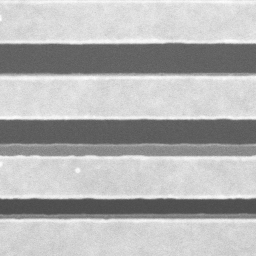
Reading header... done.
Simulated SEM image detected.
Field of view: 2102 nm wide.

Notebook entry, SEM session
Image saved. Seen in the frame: lines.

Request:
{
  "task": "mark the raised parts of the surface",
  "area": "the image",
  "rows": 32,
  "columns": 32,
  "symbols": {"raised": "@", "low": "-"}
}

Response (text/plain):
@@@@@@@@@@@@@@@@@@@@@@@@@@@@@@@@
@@@@@@@@@@@@@@@@@@@@@@@@@@@@@@@@
@@@@@@@@@@@@@@@@@@@@@@@@@@@@@@@@
@@@@@@@@@@@@@@@@@@@@@@@@@@@@@@@@
@@@@@@@@@@@@@@@@@@@@@@@@@@@@@@@@
--------------------------------
--------------------------------
--------------------------------
--------------------------------
@@@@@@@@@@@@@@@@@@@@@@@@@@@@@@@@
@@@@@@@@@@@@@@@@@@@@@@@@@@@@@@@@
@@@@@@@@@@@@@@@@@@@@@@@@@@@@@@@@
@@@@@@@@@@@@@@@@@@@@@@@@@@@@@@@@
@@@@@@@@@@@@@@@@@@@@@@@@@@@@@@@@
@@@@@@@@@@@@@@@@@@@@@@@@@@@@@@@@
--------------------------------
--------------------------------
--------------------------------
@@@@@@@@@@@@@@@@@@@@@@@@@@@@@@@@
@@@@@@@@@@@@@@@@@@@@@@@@@@@@@@@@
@@@@@@@@@@@@@@@@@@@@@@@@@@@@@@@@
@@@@@@@@@@@@@@@@@@@@@@@@@@@@@@@@
@@@@@@@@@@@@@@@@@@@@@@@@@@@@@@@@
@@@@@@@@@@@@@@@@@@@@@@@@@@@@@@@@
@@@@@@@@@@@@@@@@@@@@@@@@@@@@@@@@
--------------------------------
--------------------------------
@@@@@@@@@@@@@@@@@@@@@@@@@@@@@@@@
@@@@@@@@@@@@@@@@@@@@@@@@@@@@@@@@
@@@@@@@@@@@@@@@@@@@@@@@@@@@@@@@@
@@@@@@@@@@@@@@@@@@@@@@@@@@@@@@@@
@@@@@@@@@@@@@@@@@@@@@@@@@@@@@@@@